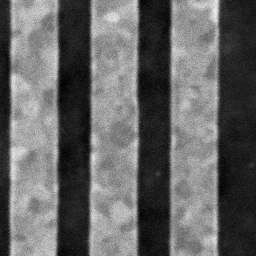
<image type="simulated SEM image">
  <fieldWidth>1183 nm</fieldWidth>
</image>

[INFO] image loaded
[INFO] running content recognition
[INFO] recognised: wiring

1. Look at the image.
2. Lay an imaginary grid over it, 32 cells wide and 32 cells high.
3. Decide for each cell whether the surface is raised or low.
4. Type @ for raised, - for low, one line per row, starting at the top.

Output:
--@@@@@----@@@@@@-----@@@@@-----
--@@@@@----@@@@@@-----@@@@@-----
--@@@@@-----@@@@@-----@@@@@-----
--@@@@@----@@@@@@-----@@@@@-----
--@@@@@----@@@@@@-----@@@@@-----
--@@@@@----@@@@@@-----@@@@@-----
-@@@@@@----@@@@@@-----@@@@@-----
-@@@@@@----@@@@@@-----@@@@@-----
-@@@@@@----@@@@@@-----@@@@@-----
-@@@@@@-----@@@@@-----@@@@@-----
-@@@@@@-----@@@@@-----@@@@@-----
--@@@@@----@@@@@@-----@@@@@-----
--@@@@@----@@@@@@-----@@@@@-----
--@@@@@----@@@@@@-----@@@@@-----
-@@@@@@----@@@@@@-----@@@@@-----
-@@@@@@----@@@@@@-----@@@@@-----
-@@@@@@----@@@@@@-----@@@@@-----
-@@@@@@----@@@@@@-----@@@@@-----
-@@@@@@----@@@@@@-----@@@@@-----
-@@@@@@----@@@@@@----@@@@@@-----
-@@@@@@----@@@@@@----@@@@@@-----
-@@@@@@----@@@@@@----@@@@@@-----
-@@@@@@----@@@@@@----@@@@@@-----
-@@@@@@----@@@@@@----@@@@@@-----
-@@@@@@----@@@@@@----@@@@@@-----
-@@@@@@----@@@@@@----@@@@@@-----
-@@@@@@----@@@@@@----@@@@@@-----
-@@@@@@----@@@@@@----@@@@@@-----
-@@@@@@----@@@@@@----@@@@@@-----
-@@@@@@----@@@@@@----@@@@@@-----
-@@@@@@----@@@@@@----@@@@@@-----
-@@@@@@----@@@@@@----@@@@@@-----